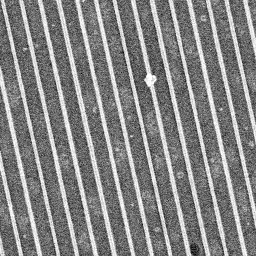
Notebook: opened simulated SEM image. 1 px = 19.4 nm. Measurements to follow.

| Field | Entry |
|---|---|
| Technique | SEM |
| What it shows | parallel lines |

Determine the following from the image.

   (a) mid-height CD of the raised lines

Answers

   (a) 66.4 nanometres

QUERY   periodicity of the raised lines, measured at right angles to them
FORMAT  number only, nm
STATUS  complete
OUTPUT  354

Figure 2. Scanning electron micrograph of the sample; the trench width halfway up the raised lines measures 0.292 µm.